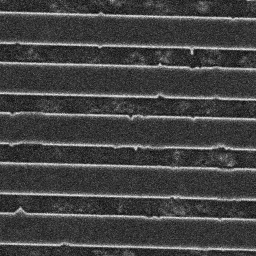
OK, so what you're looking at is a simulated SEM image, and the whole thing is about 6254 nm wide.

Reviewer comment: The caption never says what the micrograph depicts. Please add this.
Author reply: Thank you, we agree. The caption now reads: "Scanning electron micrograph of parallel lines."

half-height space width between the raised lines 488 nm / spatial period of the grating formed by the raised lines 1.22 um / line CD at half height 0.757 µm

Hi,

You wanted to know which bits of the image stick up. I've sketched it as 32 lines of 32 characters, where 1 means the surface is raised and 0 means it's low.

00000000000000000000000000000000
00000000000000000000000000000000
11111111111111111111111111111111
11111111111111111111111111111111
11111111111111111111111111111111
00000000111111111111111111111111
00000000000000000000000000000000
00000000000000000000000000000000
11111111111111111111111000110000
11111111111111111111111111111111
11111111111111111111111111111111
11111111111111111111111111111111
00000000000000000000000000000000
00000000000000000000000000000000
11111111111111000000000000000000
11111111111111111111111111111111
11111111111111111111111111111111
11111111111111111111111111111111
00000000000000000000001111101111
00000000000000000000000000000000
11110000000000000000000000000000
11111111111111111111111111111111
11111111111111111111111111111111
11111111111111111111111111111111
00000000000001111111111111111111
00000000000000000000000000000000
00100000000000000000000000000000
11111111111111111111111111111111
11111111111111111111111111111111
11111111111111111111111111111111
00011111111111111111111111111111
00000000000000000000000000000000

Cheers